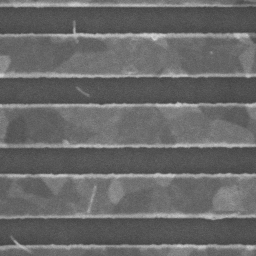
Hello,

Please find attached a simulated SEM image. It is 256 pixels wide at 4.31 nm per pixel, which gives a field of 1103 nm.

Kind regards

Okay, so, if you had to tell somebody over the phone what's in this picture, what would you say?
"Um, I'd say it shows lines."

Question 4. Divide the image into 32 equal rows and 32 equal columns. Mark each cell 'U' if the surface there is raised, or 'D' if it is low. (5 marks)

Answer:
UUUUUUUUUUUUUUUUUUUUUUUUUUUUUUUU
DDDDDDDDDDDDDDDDDDDDDDDDDDDDDDDD
DDDDDDDDDDDDDDDDDDDDDDDDDDDDDDDD
DDDDDDDDDDDDDDDDDDDDDDDDDDDDDDDD
UUUUUUUUUUUUUUUUUUUUUUUUUUUUUUUU
UUUUUUUUUUUUUUUUUUUUUUUUUUUUUUUU
UUUUUUUUUUUUUUUUUUUUUUUUUUUUUUUU
UUUUUUUUUUUUUUUUUUUUUUUUUUUUUUUU
UUUUUUUUUUUUUUUUUUUUUUUUUUUUUUUU
UUUUUUUUUUUUUUUUUUUUUUUUUUUUUUUU
DDDDDDDDDDDDDDDDDDDDDDDDDDDDDDDD
DDDDDDDDDDDDDDDDDDDDDDDDDDDDDDDD
DDDDDDDDDDDDDDDDDDDDDDDDDDDDDDDD
UUUUUUUUUUUUUUUUUUUUUUUUUUUUUUUU
UUUUUUUUUUUUUUUUUUUUUUUUUUUUUUUU
UUUUUUUUUUUUUUUUUUUUUUUUUUUUUUUU
UUUUUUUUUUUUUUUUUUUUUUUUUUUUUUUU
UUUUUUUUUUUUUUUUUUUUUUUUUUUUUUUU
DDDDDDDDDDDDDDDDDDDDDDDDDDDDDDDD
DDDDDDDDDDDDDDDDDDDDDDDDDDDDDDDD
DDDDDDDDDDDDDDDDDDDDDDDDDDDDDDDD
DDDDDDDDDDDDDDDDDDDDDDDDDDDDDDDD
UUUUUUUUUUUUUUUUUUUUUUUUUUUUUUUU
UUUUUUUUUUUUUUUUUUUUUUUUUUUUUUUU
UUUUUUUUUUUUUUUUUUUUUUUUUUUUUUUU
UUUUUUUUUUUUUUUUUUUUUUUUUUUUUUUU
UUUUUUUUUUUUUUUUUUUUUUUUUUUUUUUU
DDDDDDDDDDDDDDDDDDDDDDDDDDDDDDDD
DDDDDDDDDDDDDDDDDDDDDDDDDDDDDDDD
DDDDDDDDDDDDDDDDDDDDDDDDDDDDDDDD
DDDDDDDDDDDDDDDDDDDDDDDDDDDDDDDD
UUUUUUUUUUUUUUUUUUUUUUUUUUUUUUUU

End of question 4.